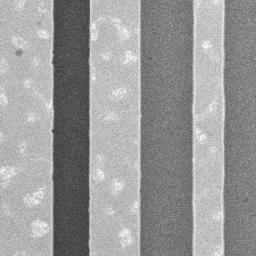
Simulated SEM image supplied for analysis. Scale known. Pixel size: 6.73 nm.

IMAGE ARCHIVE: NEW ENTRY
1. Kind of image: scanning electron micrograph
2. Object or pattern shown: one or a few lines or trenches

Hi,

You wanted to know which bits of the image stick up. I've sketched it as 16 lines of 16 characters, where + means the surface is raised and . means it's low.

+++...+++...++..
+++...+++...++..
+++...+++...++..
+++...+++...++..
+++...+++...++..
+++...+++...++..
+++...+++...++..
+++...+++...++..
+++...+++...++..
+++...+++...++..
+++...+++...++..
+++...+++...++..
+++...+++...++..
+++...+++...++..
+++...+++...++..
+++...+++...++..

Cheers